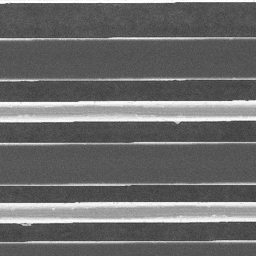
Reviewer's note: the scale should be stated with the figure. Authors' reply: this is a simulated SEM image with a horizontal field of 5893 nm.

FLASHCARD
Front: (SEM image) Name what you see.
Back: lines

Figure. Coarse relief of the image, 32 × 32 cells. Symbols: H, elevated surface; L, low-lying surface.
LLLLLLLLLLLLLLLLLLLLLLLLLLLLLLLL
LLLLLLLLLLLLLLLLLLLLLLLLLLLLLLLL
LLLLLLLLLLLLLLLLLLLLLLLLLLLLLLLL
LLLLLLLLLLLLLLLLLLLLLLLLLLLLLLLL
LLLLLLLLLLLLLLLLLLLLLLLLLLLLLLLL
HHHHHHHHHHHHHHHHHHHHHHHHHHHHHHHH
HHHHHHHHHHHHHHHHHHHHHHHHHHHHHHHH
HHHHHHHHHHHHHHHHHHHHHHHHHHHHHHHH
HHHHHHHHHHHHHHHHHHHHHHHHHHHHHHHH
HHHHHHHHHHHHHHHHHHHHHHHHHHHHHHHH
LLLLLLLLLLLLLLLLLLLLLLLLLLLLLLLL
LLLLLLLLLLLLLLLLLLLLLLLLLLLLLLLL
LLLLLLLLLLLLLLLLLLLLLLLLLLLLLLLL
HHHHHHHHHHHHHHHHHHHHHHHHHHHHHHHH
HHHHHHHHHHHHHHHHHHHHHHHHHHHHHHHH
LLLLLLLLLLLLLLLLLLLLLLLLLLLLLLLL
LLLLLLLLLLLLLLLLLLLLLLLLLLLLLLLL
LLLLLLLLLLLLLLLLLLLLLLLLLLLLLLLL
HHHHHHHHHHHHHHHHHHHHHHHHHHHHHHHH
HHHHHHHHHHHHHHHHHHHHHHHHHHHHHHHH
HHHHHHHHHHHHHHHHHHHHHHHHHHHHHHHH
HHHHHHHHHHHHHHHHHHHHHHHHHHHHHHHH
HHHHHHHHHHHHHHHHHHHHHHHHHHHHHHHH
LLLLLLLLLLLLLLLLLLLLLLLLLLLLLLLL
LLLLLLLLLLLLLLLLLLLLLLLLLLLLLLLL
LLLLLLLLLLLLHHHHHHHHHHHHHHHHHHHH
HHHHHHHHHHHHHHHHHHHHHHHHHHHHHHHH
HHHHHHHHHHHHHHHHHHHHHHHHHHHHHHHH
LLLLLLLLLLLLLLLLLLLLLLLLLLLLLLLL
LLLLLLLLLLLLLLLLLLLLLLLLLLLLLLLL
HHHHHHHHHHHHHHHHHHHHHHHHHHHHHHHH
HHHHHHHHHHHHHHHHHHHHHHHHHHHHHHHH